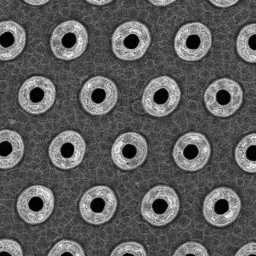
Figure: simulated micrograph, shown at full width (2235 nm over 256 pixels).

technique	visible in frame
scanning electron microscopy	a regular array of ring-shaped raised bodies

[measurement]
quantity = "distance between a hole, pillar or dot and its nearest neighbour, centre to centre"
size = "542 nanometers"